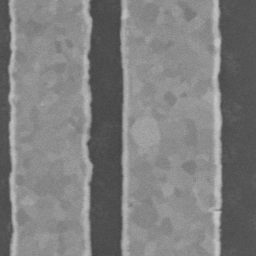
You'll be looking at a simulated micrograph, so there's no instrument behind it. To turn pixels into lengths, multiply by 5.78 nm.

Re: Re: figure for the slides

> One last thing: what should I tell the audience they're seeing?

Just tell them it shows one or a few lines or trenches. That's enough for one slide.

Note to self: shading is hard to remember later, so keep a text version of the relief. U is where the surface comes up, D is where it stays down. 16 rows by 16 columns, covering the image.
DUUUUDDDUUUUUUDD
DUUUUUDDUUUUUDDD
DUUUUDDDUUUUUUDD
DUUUUDDDUUUUUUDD
DUUUUDDDUUUUUDDD
DUUUUDDDUUUUUDDD
DUUUUDDDUUUUUUDD
DUUUUDDDUUUUUUDD
DUUUUDDDUUUUUUDD
DUUUUDDDUUUUUUDD
DUUUUUDDUUUUUUDD
DUUUUDDDUUUUUUDD
DUUUUDDDUUUUUUDD
DUUUUDDDUUUUUUDD
DUUUUDDDUUUUUUDD
DUUUUDDDUUUUUUDD